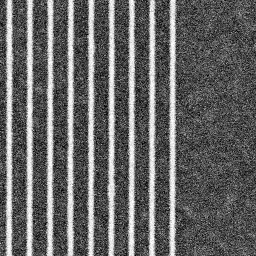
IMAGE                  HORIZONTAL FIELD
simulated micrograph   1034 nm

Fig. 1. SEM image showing parallel lines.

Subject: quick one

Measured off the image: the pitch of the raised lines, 0.0825 micrometres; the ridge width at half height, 14.2 nm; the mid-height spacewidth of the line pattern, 67.7 nm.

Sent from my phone